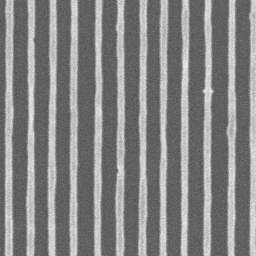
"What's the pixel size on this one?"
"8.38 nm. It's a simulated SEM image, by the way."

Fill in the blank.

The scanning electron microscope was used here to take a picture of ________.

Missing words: parallel lines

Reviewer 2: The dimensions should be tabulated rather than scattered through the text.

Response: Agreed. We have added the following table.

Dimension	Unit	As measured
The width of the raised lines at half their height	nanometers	49.2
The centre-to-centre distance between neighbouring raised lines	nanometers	186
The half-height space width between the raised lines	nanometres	138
